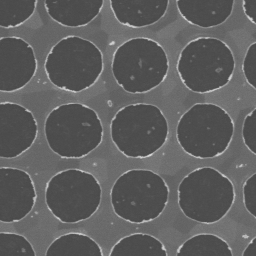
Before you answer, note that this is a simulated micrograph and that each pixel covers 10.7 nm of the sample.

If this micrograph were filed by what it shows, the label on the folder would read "a regular array of holes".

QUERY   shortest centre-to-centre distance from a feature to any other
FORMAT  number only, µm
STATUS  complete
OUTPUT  0.699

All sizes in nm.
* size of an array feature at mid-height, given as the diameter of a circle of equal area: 584